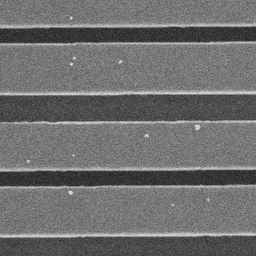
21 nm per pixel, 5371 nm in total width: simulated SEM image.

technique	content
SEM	lines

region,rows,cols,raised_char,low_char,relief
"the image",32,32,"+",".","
++++++++++++++++++++++++++++++++
++++++++++++++++++++++++++++++++
++++++++++++++++++++++++++++++++
................................
................................
++++++++++++++++++++++++++++++++
++++++++++++++++++++++++++++++++
++++++++++++++++++++++++++++++++
++++++++++++++++++++++++++++++++
++++++++++++++++++++++++++++++++
++++++++++++++++++++++++++++++++
++++++++++++++++++++++++++++++++
................................
................................
................................
++++++++++++++++++++++++++++++++
++++++++++++++++++++++++++++++++
++++++++++++++++++++++++++++++++
++++++++++++++++++++++++++++++++
++++++++++++++++++++++++++++++++
++++++++++++++++++++++++++++++++
................................
................................
++++++++++++++++++++++++++++++++
++++++++++++++++++++++++++++++++
++++++++++++++++++++++++++++++++
++++++++++++++++++++++++++++++++
++++++++++++++++++++++++++++++++
++++++++++++++++++++++++++++++++
++++++++........................
................................
................................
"